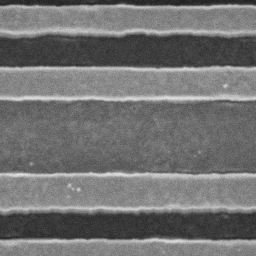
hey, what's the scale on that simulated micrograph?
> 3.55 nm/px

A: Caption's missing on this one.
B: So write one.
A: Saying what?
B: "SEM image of lines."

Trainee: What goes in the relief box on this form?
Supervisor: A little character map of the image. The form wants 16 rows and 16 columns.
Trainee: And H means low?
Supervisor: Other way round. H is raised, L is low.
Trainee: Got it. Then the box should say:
HHHHHHHHHHHHHHHH
HHHHHHHHHHHHHHHH
LLLLLLLLLLLLLLLL
LLLLLLLLLLLLLLLL
HHHHHHHHHHHHHHHH
HHHHHHHHHHHHHHHH
LLLLLLLLLLLLLLLL
LLLLLLLLLLLLLLLL
LLLLLLLLLLLLLLLL
LLLLLLLLLLLLLLLL
LLLLLLLLLLLLLLLL
HHHHHHHHHHHHHHHH
HHHHHHHHHHHHHHHH
LLLLLLLLLLLLLLLL
LLLLLLLLLLLLLLLL
HHHHHHHHHHHHHHHH